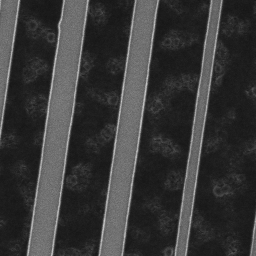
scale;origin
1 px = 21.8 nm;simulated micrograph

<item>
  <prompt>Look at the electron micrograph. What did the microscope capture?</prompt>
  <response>one or a few lines or trenches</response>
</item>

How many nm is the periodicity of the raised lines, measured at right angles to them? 1550